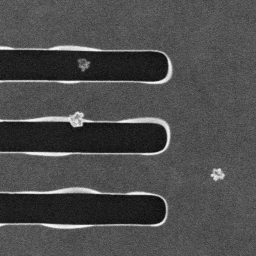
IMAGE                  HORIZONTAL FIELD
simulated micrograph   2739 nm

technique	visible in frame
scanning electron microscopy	groups of lines, slits or small figures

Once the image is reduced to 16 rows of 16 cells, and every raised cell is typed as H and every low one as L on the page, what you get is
HHHHHHHHHHHHHHHH
HHHHHHHHHHHHHHHH
HHHHHHHHHHHHHHHH
LLLLLLLLLLHHHHHH
LLLLLLLLLLLHHHHH
HHHHHHHHHHHHHHHH
HHHHHHHHHHHHHHHH
HHLLHHHHHHHHHHHH
LLLLLLLLLLHHHHHH
LLLLLLLLLLHHHHHH
HHHHHHHHHHHHHHHH
HHHHHHHHHHHHHHHH
LLLLLLLLLLHHHHHH
LLLLLLLLLLHHHHHH
HHHHHHHHHHHHHHHH
HHHHHHHHHHHHHHHH